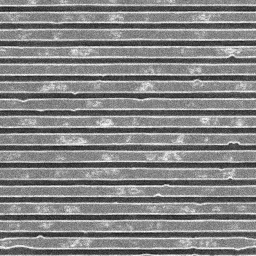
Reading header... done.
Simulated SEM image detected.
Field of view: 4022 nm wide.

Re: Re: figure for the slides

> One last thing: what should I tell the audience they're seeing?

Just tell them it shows parallel lines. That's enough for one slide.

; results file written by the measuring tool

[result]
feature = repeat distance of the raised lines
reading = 273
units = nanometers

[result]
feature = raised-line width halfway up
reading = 177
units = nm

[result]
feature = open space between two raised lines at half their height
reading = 0.102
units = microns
